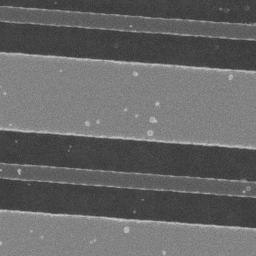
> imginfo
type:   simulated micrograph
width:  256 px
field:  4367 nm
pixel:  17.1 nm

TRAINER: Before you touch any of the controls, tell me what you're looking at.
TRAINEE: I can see lines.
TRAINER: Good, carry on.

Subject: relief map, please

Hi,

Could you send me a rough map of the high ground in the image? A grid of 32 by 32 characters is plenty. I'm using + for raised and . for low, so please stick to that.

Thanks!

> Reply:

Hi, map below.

................................
+++++++++.......................
+++++++++++++++++++++++.........
..........++++++++++++++++++++++
........................++++++++
................................
................................
++++++++++++....................
++++++++++++++++++++++++++......
++++++++++++++++++++++++++++++++
++++++++++++++++++++++++++++++++
++++++++++++++++++++++++++++++++
++++++++++++++++++++++++++++++++
++++++++++++++++++++++++++++++++
++++++++++++++++++++++++++++++++
++++++++++++++++++++++++++++++++
...+++++++++++++++++++++++++++++
.................+++++++++++++++
..............................++
................................
+...............................
+++++++++++++++.................
..+++++++++++++++++++++++++++...
................++++++++++++++++
.............................+++
................................
+++.............................
+++++++++++++++++...............
+++++++++++++++++++++++++++++++.
++++++++++++++++++++++++++++++++
++++++++++++++++++++++++++++++++
++++++++++++++++++++++++++++++++